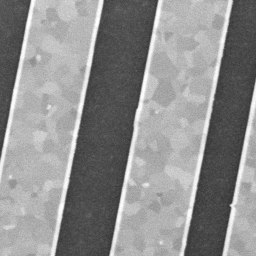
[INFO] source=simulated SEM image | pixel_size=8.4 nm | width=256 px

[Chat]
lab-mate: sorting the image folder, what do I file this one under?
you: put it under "one or a few lines or trenches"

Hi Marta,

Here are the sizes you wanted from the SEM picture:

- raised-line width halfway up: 0.58 um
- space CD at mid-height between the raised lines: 479 nm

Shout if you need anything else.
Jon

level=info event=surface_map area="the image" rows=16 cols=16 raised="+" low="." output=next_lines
..++++....++++..
..++++....++++..
..++++....++++..
.+++++...+++++..
.+++++...+++++..
.++++....++++...
.++++....++++...
.++++....++++...
+++++...+++++..+
+++++...+++++..+
++++....++++...+
++++....++++...+
++++....++++...+
++++...+++++..++
++++...+++++..++
+++....++++...++